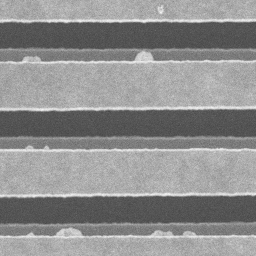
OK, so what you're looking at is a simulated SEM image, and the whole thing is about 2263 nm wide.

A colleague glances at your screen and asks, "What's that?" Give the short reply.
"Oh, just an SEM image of lines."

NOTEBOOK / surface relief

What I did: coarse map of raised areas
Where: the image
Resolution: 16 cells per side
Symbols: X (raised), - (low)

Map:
XXXXXXXXXXXXXXXX
----------------
----------------
XXXXXXXXXXXXXXXX
XXXXXXXXXXXXXXXX
XXXXXXXXXXXXXXXX
XXXXXXXXXXXXXXXX
----------------
----------------
XXXXXXXXXXXXXXXX
XXXXXXXXXXXXXXXX
XXXXXXXXXXXXXXXX
----------------
----------------
XXXXXXXXXXXXXXXX
XXXXXXXXXXXXXXXX